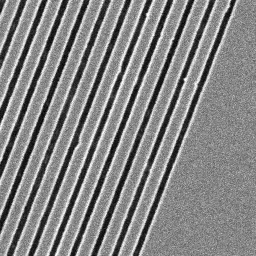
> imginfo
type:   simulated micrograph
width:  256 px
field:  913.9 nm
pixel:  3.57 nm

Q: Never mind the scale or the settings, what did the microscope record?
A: parallel lines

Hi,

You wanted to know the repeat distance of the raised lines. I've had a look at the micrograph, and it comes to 19.6 pixels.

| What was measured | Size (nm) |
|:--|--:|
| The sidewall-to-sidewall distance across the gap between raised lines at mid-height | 20.4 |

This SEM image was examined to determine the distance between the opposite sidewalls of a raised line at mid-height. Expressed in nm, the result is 47.1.